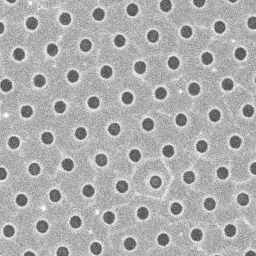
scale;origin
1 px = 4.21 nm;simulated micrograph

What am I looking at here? a regular array of holes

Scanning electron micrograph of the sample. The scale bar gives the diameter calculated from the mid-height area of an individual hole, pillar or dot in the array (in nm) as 55.9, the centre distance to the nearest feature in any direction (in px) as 33.4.